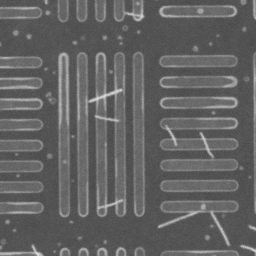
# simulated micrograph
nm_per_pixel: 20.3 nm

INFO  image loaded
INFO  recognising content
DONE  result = groups of lines, slits or small figures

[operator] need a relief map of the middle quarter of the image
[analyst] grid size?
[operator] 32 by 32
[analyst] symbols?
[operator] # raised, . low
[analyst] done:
#...##..##...##..###.....#..####
#...##..##...##..###............
#...##..##...##..###............
#...##..##...##..###.......#####
#...##..##...##..###....########
#...##..##...##..###.....#######
#...##..##...##..###............
#...##..###..##..###............
#...##..##...##..###..........##
#...##..##...##..###....########
#...##..##...##..###.....#######
#...##..##...##..###............
#...##..##...##..###............
#...##..###..##..###............
#...##..##...##..###....########
#...##..##...##..###....########
#...##..##...##...##......#.....
#...##..##...##...##............
#...##..##...##...##.......#....
#...##..##...##...##....########
#...##..##...##...##....########
#...##..##...##...##............
#...##..##...##...##............
#...##..##...##...##............
#...##..##...##...##.....#######
#...##..##...##...##....########
#...##..##...##...##............
#...##..###..##...##............
#...##..###..##...##............
#...##..###..##...##.....#######
#...##..###..##...##....########
#...##..###..##...##.....#######